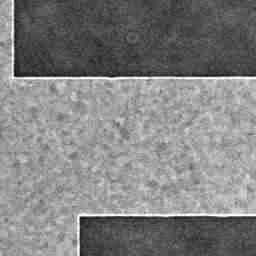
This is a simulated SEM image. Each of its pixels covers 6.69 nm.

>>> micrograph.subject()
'one or a few lines or trenches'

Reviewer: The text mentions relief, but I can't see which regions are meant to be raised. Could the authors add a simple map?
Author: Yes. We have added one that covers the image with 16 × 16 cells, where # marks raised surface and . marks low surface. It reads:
#...............
#...............
#...............
#...............
#...............
################
################
################
################
################
################
################
################
#####...........
#####...........
#####...........